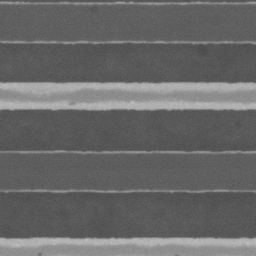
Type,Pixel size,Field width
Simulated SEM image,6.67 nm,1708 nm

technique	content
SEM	lines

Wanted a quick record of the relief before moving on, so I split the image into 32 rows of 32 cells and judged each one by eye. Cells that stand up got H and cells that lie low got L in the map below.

HHHHHHHHHHHHHHHHHHHHHHHHHHHHHHHH
HHHHHHHHHHHHHHHHHHHHHHHHHHHHHHHH
HHHHHHHHHHHHHHHHHHHHHHHHHHHHHHHH
HHHHHHHHHHHHHHHHHHHHHHHHHHHHHHHH
HHHHHHHHHHHHHHHHHHHHHHHHHHHHHHHH
LLLLLLLLLLLLLLLLLLLLLLLLLLLLLLLL
LLLLLLLLLLLLLLLLLLLLLLLLLLLLLLLL
LLLLLLLLLLLLLLLLLLLLLLLLLLLLLLLL
LLLLLLLLLLLLLLLLLLLLLLLLLLLLLLLL
LLLLLLLLLLLLLLLLLLLLLLLLLLLLLLLL
LLLLLLLLLLHHLHLLLLLLLLLLLLLLLLLL
HHHHHHHHHHHHHHHHHHHHHHHHHHHHHHHH
HHHHHHHHHHHHHHHHHHHHHHHHHHHHHHHH
LHLHHHHHLHHHHHLHHHHHLLHHHHHHHHHH
LLLLLLLLLLLLLLLLLLLLLLLLLLLLLLLL
LLLLLLLLLLLLLLLLLLLLLLLLLLLLLLLL
LLLLLLLLLLLLLLLLLLLLLLLLLLLLLLLL
LLLLLLLLLLLLLLLLLLLLLLLLLLLLLLLL
LLLLLLLLLLLLLLLLLLLLLLLLLLLLLLLL
HHHHHHHHHHHHHHHHHHHHHHHHHHHHHHHH
HHHHHHHHHHHHHHHHHHHHHHHHHHHHHHHH
HHHHHHHHHHHHHHHHHHHHHHHHHHHHHHHH
HHHHHHHHHHHHHHHHHHHHHHHHHHHHHHHH
HHHHHHHHHHHHHHHHHHHHHHHHHHHHHHHH
LLLLLLLLLLLLLLLLLLLLLLLLLLLLLLLL
LLLLLLLLLLLLLLLLLLLLLLLLLLLLLLLL
LLLLLLLLLLLLLLLLLLLLLLLLLLLLLLLL
LLLLLLLLLLLLLLLLLLLLLLLLLLLLLLLL
LLLLLLLLLLLLLLLLLLLLLLLLLLLLLLLL
LLLLLLLLLLLLLLLLLLLLLLLLLLLLLLLL
HHHHHHHHHHHHHHHHHHHHHHHHHHHHHHHH
HHHHHHHHHHHHHHHHHHHHHHHHHHHHHHHH